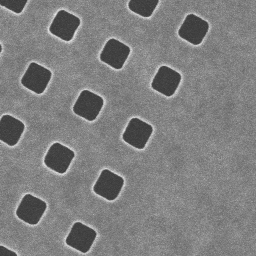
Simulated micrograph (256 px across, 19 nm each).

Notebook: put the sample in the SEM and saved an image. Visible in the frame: a regular array of holes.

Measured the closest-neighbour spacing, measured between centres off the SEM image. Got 1090 nm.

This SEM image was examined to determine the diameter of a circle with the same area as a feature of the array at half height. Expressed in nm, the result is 544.